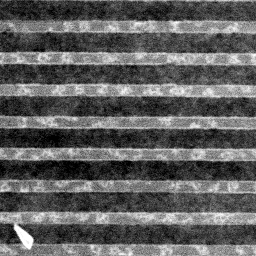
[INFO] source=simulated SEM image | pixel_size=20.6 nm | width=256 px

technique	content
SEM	parallel lines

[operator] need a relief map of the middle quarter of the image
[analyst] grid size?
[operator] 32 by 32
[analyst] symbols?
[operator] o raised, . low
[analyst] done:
oooooooooooooooooooooooooooooooo
oooooooooooooooooooooooooooooooo
oooooooooooooooooooooooooooooooo
oooooooooooooooooooooooooooooooo
oooooooooooooooooooooooooooooooo
................................
................................
...o............................
oooooooooooooooooooooooooooooooo
oooooooooooooooooooooooooooooooo
oooooooooooooooooooooooooooooooo
oooooooooooooooooooooooooooooooo
oooooooooooooooooooooooooooooooo
................................
................................
................................
oooooooooooooooooooooooooooooooo
oooooooooooooooooooooooooooooooo
oooooooooooooooooooooooooooooooo
oooooooooooooooooooooooooooooooo
oooooooooooooooooooooooooooooooo
................................
................................
................................
oooooooooooooooooooooooooooooooo
oooooooooooooooooooooooooooooooo
oooooooooooooooooooooooooooooooo
oooooooooooooooooooooooooooooooo
oooooooooooooooooooooooooooooooo
................................
................................
................................